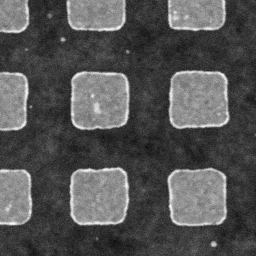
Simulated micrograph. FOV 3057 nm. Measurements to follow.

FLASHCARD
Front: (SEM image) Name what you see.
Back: raised bodies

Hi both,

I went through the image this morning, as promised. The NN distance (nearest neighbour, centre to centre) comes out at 1160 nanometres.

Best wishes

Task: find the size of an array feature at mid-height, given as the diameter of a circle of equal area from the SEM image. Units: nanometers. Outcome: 727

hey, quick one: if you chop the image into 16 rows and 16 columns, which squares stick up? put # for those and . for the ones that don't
##..####...###..
##..####...###..
................
................
............#...
##...###...###..
##...###...###..
##...###...###..
................
................
................
##..####...###..
##..####...###..
##...###...###..
................
................